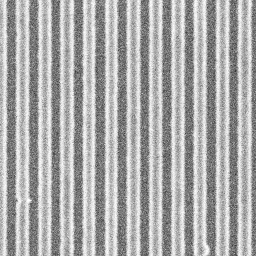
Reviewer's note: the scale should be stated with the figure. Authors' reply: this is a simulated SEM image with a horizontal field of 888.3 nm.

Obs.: parallel lines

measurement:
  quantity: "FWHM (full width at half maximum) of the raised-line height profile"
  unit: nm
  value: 42.1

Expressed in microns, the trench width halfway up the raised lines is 0.0356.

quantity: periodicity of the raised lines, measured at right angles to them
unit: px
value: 22.2